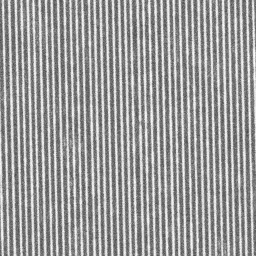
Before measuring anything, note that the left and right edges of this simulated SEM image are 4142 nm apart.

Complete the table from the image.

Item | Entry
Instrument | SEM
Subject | parallel lines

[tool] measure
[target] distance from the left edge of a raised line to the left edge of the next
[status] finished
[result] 0.0987 microns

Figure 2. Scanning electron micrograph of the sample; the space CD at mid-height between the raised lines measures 74.8 nm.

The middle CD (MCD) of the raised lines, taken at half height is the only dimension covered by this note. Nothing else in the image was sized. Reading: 22.2 nm